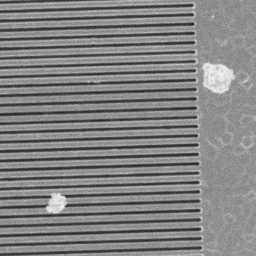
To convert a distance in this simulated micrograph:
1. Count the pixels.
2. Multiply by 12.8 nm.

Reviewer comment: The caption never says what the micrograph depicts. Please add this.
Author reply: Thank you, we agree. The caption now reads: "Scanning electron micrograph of parallel lines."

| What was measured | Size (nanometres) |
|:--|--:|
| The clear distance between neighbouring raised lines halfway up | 44.7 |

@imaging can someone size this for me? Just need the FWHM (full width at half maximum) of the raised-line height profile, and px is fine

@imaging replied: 5.12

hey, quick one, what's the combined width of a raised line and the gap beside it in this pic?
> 119 nanometers